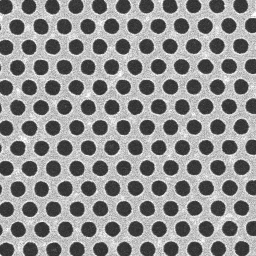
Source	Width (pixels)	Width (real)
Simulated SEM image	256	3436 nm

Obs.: a regular array of holes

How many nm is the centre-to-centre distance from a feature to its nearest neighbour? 308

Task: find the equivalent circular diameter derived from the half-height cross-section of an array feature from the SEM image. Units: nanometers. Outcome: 212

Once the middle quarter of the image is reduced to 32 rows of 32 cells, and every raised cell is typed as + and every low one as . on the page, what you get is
..++....++....++....++....+.....
..++....++....++....++...+++...+
.++++..++++..++++..++++.+++++.++
++++++++++++++++++++++++++++++++
++..++++..+++...+++...+++...+++.
+....++....++....++....++....+..
+....++....++....++....++....++.
++..++++..++++..++++..++++..++++
++++++++++++++++++++++++++++++++
..+++..+++...+++...+++...+++...+
..++....++....++....++....++...+
..++....++....++....++....++...+
.++++..++++..++++..++++..++++..+
++++++++++++++++++++++++++++++++
++..++++...++...+++...+++...+++.
+....++....++....++....++....++.
+....++....++....++....++....++.
++..++++..++++..++++..++++..++++
++++++++++++++++++++++++++++++++
..+++..++++..++++..++++..+++...+
..++....++....++....++....++...+
..++....++....++....++....++...+
..+++..++++..++++..++++..+++...+
++++++++++++++++++++++++++++++++
++..++++..++++..++++..+++...+++.
+....++....++....++....++....++.
+....++....++....++....++....++.
++...+++...+++..+++...+++...+++.
++++++++++++++++++++++++++++++++
.++++..++++..+++...+++...+++...+
..++....++....++....++....++...+
..++....++....++....++....++....